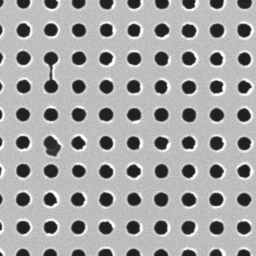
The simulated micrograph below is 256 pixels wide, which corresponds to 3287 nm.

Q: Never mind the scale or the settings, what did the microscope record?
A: a regular array of holes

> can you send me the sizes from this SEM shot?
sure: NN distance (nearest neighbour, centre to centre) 27.4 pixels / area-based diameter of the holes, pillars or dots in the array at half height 186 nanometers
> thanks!